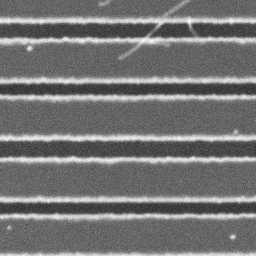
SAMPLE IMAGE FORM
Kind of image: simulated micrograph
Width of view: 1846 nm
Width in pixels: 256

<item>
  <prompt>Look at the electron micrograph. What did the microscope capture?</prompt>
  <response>lines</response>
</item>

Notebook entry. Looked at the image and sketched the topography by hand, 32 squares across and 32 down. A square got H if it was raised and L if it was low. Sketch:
HHHHHHHHHHHHHHHHHHHHHHHHHHHHHHHH
HHHHHHHHHHHHHHHHHHHHHHHHHHHHHHHH
HHHHHHHHHHHHHHHHHHHHHHHHHHHHHHHH
LLLLLLLLLLLLLLLLLLLLLLLLLLLLLLLL
LLLLLLLLLLLLLLLLLLLLLLLLLLLLLLLL
HHHHHHHHHHHHHHHHHHHHHHHHHHHHHHHH
HHHHHHHHHHHHHHHHHHHHHHHHHHHHHHHH
HHHHHHHHHHHHHHHHHHHHHHHHHHHHHHHH
HHHHHHHHHHHHHHHHHHHHHHHHHHHHHHHH
HHHHHHHHHHHHHHHHHHHHHHHHHHHHHHHH
LLLLLLLLLLLLLLLLLLLLLLLLLLLLLLLL
LLLLLLLLLLLLLLLLLLLLLLLLLLLLLLLL
HHHHHHHHHHHHHHHHHHHHHHHHHHHHHHHH
HHHHHHHHHHHHHHHHHHHHHHHHHHHHHHHH
HHHHHHHHHHHHHHHHHHHHHHHHHHHHHHHH
HHHHHHHHHHHHHHHHHHHHHHHHHHHHHHHH
HHHHHHHHHHHHHHHHHHHHHHHHHHHHHHHH
LLLLLLLLLHLHLLLLLLLLLHLLLLHLLLHL
LLLLLLLLLLLLLLLLLLLLLLLLLLLLLLLL
LLLLLLLLLLLLLLLLLLLLLLLLLLLLLLLL
HHHHHHHHHHHHHHHHHHHHHHHHHHHHHHHH
HHHHHHHHHHHHHHHHHHHHHHHHHHHHHHHH
HHHHHHHHHHHHHHHHHHHHHHHHHHHHHHHH
HHHHHHHHHHHHHHHHHHHHHHHHHHHHHHHH
HHHHHHHHHHHHHHHHHHHHHHHHHHHHHHHH
LLLLLLLLLLLLLLLLLLLLLLLLLLLLLLLL
LLLLLLLLLLLLLLLLLLLLLLLLLLLLLLLL
HHHHHHHHHHHHHHHHHHHHHHHHHHHHHHHH
HHHHHHHHHHHHHHHHHHHHHHHHHHHHHHHH
HHHHHHHHHHHHHHHHHHHHHHHHHHHHHHHH
HHHHHHHHHHHHHHHHHHHHHHHHHHHHHHHH
HHHHHHHHHHHHHHHHHHHHHHHHHHHHHHHH